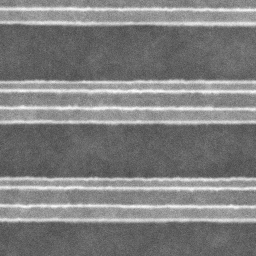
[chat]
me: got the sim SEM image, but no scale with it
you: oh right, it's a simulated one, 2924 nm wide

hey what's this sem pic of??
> lines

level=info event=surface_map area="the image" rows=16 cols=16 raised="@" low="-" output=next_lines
@@@@@@@@@@@@@@@@
----------------
----------------
----------------
----------------
@@@@@@@@@@@@@@@@
@@@@@@@@@@@@@@@@
@@@@@@@@@@@@@@@@
----------------
----------------
----------------
@@@@@@@@@@@@@@@@
@@@@@@@@@@@@@@@@
@@@@@@@@@@@@@@@@
----------------
----------------